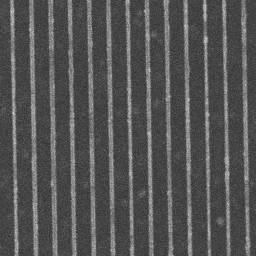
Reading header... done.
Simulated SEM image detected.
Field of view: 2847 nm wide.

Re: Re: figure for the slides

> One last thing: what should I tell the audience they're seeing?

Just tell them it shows parallel lines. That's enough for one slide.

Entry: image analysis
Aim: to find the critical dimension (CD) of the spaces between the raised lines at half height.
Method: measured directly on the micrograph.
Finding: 181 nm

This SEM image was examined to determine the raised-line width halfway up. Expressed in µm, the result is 0.0361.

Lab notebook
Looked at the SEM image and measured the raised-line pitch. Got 19.3 pixels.